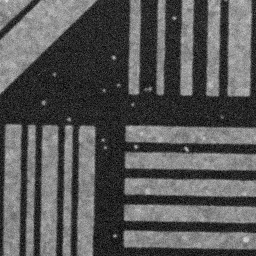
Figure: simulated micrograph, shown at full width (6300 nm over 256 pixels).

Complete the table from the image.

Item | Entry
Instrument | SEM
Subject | groups of lines, slits or small figures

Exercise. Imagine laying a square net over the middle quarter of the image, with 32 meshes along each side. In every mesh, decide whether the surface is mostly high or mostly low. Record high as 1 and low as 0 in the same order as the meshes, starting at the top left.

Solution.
00000000000000001110000010000111
00000000000000001110000110000111
00000000000000001110000110000111
00000000000000001110000110000111
00000000000000001110000110000111
00000000000000001110000110000111
00000000000000001110000110000111
00000000000000000000000010000111
00000000000000000000000000000000
00000000000000000000000000000000
00000000000000000000000000000000
00000000000000000000000000000000
00000000000000000000000000000000
00000000000000000000000000000000
00000000000000000000000000000000
00000000000000000000000000000000
11001111000000001111111111111111
11001111000000001111111111111111
11001111000000001111111111111111
11001111000000000000000011111111
11001111000000000000000000000000
11001111000000000000000000000000
11001111000000001111111111111100
11001111000000001111111111111111
11001111000000001111111111111111
11001110000000011111111111111111
11001110000000000000000000000000
11001110000000000000000000000000
11001110000000000000000000000000
11001110000000011111111111111111
11001110000000011111111111111111
11001110000000011111111111111111